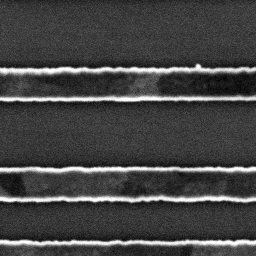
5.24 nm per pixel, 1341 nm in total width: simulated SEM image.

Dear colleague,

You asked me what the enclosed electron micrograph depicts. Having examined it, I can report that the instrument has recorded lines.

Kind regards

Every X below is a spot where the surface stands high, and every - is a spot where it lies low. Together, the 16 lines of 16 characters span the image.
----------------
----------------
----------------
----------------
XXXXXXXXXXXXXXXX
XXXXXXXXXXXXXXXX
----------------
----------------
----------------
----------------
------XXXXX-----
XXXXXXXXXXXXXXXX
XXXXXXXXXXXXX-XX
----------------
----------------
XXXXXXXXXXXXXXXX